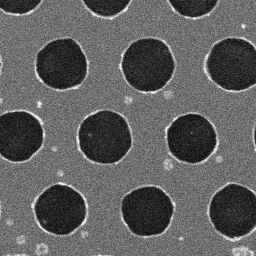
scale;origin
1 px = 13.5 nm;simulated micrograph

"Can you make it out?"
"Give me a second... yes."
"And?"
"holes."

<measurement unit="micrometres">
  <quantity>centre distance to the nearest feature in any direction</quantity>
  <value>1.14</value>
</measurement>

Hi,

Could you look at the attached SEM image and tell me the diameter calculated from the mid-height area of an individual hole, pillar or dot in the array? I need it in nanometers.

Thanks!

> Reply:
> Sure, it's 690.